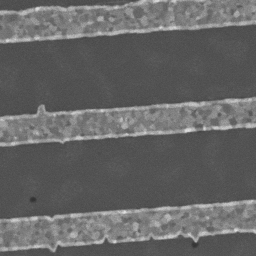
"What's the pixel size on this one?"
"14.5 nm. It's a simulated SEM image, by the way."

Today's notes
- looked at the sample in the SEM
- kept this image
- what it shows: one or a few lines or trenches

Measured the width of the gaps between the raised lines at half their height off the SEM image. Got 1100 nanometres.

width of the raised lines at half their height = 403 nm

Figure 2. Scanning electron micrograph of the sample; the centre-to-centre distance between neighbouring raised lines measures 1500 nanometres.